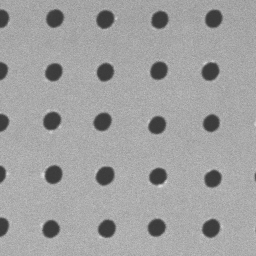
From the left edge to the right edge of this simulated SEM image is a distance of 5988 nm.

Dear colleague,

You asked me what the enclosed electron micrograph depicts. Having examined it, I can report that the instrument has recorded a regular array of holes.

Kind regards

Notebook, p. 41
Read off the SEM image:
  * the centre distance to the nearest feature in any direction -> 1.18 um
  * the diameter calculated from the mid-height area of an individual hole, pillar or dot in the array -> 436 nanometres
